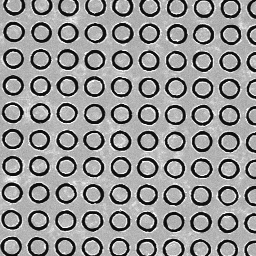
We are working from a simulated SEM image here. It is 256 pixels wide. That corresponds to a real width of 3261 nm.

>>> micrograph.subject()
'a regular array of ring-shaped grooves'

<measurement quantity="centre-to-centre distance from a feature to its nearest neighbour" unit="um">0.336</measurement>